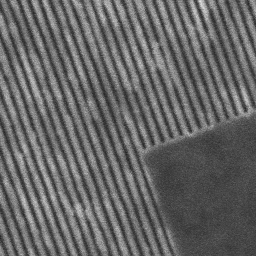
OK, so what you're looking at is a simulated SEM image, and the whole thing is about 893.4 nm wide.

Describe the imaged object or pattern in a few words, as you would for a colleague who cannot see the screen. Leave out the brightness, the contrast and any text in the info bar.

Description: parallel lines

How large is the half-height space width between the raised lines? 15.5 nm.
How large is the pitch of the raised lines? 9.77 pixels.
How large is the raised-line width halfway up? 0.0189 um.